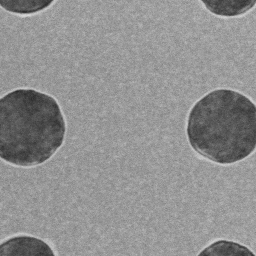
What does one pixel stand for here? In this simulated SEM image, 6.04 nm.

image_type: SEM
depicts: holes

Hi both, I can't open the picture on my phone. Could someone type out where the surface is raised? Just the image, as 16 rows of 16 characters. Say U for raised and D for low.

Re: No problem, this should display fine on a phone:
DDDUUUUUUUUUUDDD
UUUUUUUUUUUUUUUU
UUUUUUUUUUUUUUUU
UUUUUUUUUUUUUUUU
UUUUUUUUUUUUUUUU
UUUUUUUUUUUUUUUU
DDDDUUUUUUUUDDDD
DDDDUUUUUUUUDDDD
DDDDUUUUUUUUDDDD
DDDUUUUUUUUUDDDD
UUUUUUUUUUUUUUUU
UUUUUUUUUUUUUUUU
UUUUUUUUUUUUUUUU
UUUUUUUUUUUUUUUU
UUUUUUUUUUUUUUUU
DDDUUUUUUUUUUDDU